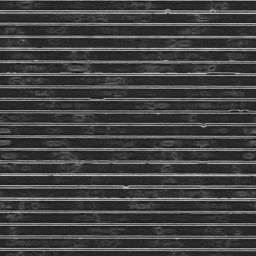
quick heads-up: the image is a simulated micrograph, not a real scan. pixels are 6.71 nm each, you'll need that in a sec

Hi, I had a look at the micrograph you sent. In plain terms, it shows parallel lines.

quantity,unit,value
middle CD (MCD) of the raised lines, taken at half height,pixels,2.88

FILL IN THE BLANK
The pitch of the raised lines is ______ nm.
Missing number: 84.1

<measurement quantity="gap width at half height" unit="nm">70.5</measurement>